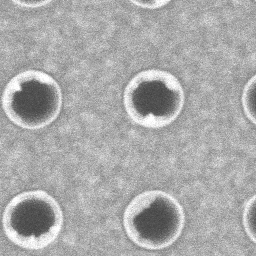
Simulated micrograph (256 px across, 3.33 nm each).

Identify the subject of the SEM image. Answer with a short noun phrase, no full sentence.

raised bodies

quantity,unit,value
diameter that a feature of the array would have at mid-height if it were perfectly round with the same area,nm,192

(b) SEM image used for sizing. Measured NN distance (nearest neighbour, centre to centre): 401 nanometres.